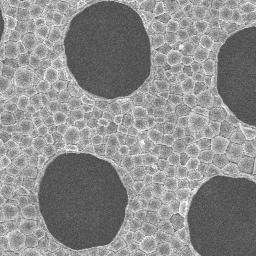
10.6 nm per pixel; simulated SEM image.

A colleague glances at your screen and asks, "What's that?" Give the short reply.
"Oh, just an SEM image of holes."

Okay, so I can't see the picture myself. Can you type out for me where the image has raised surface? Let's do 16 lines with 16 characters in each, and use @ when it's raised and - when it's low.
@@@@@---@@@@@@@@
@@@@-----@@@@@@@
@@@@-----@@@@@--
@@@@-----@@@@@--
@@@@-----@@@@@--
@@@@@----@@@@@--
@@@@@@@@@@@@@@--
@@@@@@@@@@@@@@@-
@@@@@@@@@@@@@@@@
@@@@@@@@@@@@@@@@
@@@----@@@@@@@@@
@@------@@@@@---
@@------@@@@----
@@@-----@@@@----
@@@----@@@@@----
@@@@--@@@@@@----